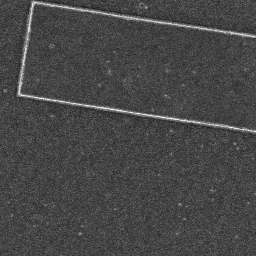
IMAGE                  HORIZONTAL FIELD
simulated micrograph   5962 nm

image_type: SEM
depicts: one or a few lines or trenches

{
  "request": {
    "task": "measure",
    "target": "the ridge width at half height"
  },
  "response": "94.1 px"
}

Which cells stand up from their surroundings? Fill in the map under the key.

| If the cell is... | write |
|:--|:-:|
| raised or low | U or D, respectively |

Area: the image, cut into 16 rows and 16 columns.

DDUUDDDDDDDDDDDD
DDUUUUUUUUUDDDDD
DDUUUUUUUUUUUUUU
DDUUUUUUUUUUUUUU
DUUUUUUUUUUUUUUU
DUUUUUUUUUUUUUUU
DDDDDUUUUUUUUUUU
DDDDDDDDDDDUUUUU
DDDDDDDDDDDDDDDD
DDDDDDDDDDDDDDDD
DDDDDDDDDDDDDDDD
DDDDDDDDDDDDDDDD
DDDDDDDDDDDDDDDD
DDDDDDDDDDDDDDDD
DDDDDDDDDDDDDDDD
DDDDDDDDDDDDDDDD